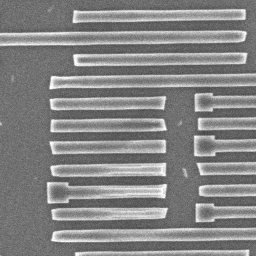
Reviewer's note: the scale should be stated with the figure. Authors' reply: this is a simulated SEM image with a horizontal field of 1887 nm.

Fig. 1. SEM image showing wiring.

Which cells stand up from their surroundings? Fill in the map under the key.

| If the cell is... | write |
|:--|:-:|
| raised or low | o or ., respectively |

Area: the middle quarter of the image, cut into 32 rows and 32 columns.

................................
................................
................................
oooooooooooooooooooooooooooooooo
oooooooooooooooooooooooooooooooo
oooooooooooooooooooooooooooooooo
................................
................................
.......oooooooooooooooooo.......
ooooooooooooooooooooooooo.......
ooooooooooooooooooooooooo.......
................................
................................
................................
ooooooooooooooooooooooooo.......
ooooooooooooooooooooooooo.......
ooooooooooooooooooooooooo.......
................................
................................
.......oooooooooooooooooo.......
ooooooooooooooooooooooooo.......
ooooooooooooooooooooooooo.......
................................
................................
................................
ooooooooooooooooooooooooo.......
ooooooooooooooooooooooooo.......
ooooooooooooooooooooooooo.......
................................
................................
o...................oooooo......
ooooooooooooooooooooooooo.......